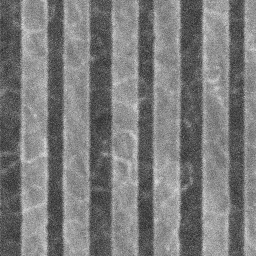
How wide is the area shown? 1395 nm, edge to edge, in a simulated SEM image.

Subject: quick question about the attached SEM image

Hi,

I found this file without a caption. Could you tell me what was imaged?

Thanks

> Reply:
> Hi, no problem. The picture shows parallel lines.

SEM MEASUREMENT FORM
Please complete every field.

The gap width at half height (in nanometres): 98.2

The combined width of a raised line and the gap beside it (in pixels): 44.9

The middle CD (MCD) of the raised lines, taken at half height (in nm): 133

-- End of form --